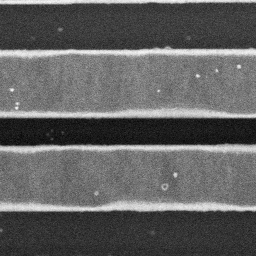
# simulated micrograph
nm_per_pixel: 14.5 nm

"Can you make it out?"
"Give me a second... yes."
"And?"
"lines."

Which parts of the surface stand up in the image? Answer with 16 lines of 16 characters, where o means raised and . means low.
................
................
................
oooooooooooooooo
oooooooooooooooo
oooooooooooooooo
oooooooooooooooo
................
................
oooooooooooooooo
oooooooooooooooo
oooooooooooooooo
oooooooooooooooo
................
................
................